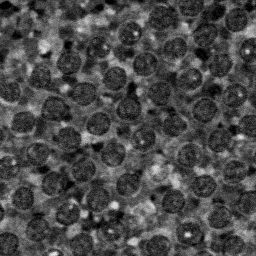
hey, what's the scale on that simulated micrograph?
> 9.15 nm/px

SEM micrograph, a regular array of holes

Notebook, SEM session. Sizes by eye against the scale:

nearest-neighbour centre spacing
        307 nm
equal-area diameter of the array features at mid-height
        0.229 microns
